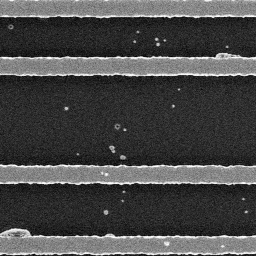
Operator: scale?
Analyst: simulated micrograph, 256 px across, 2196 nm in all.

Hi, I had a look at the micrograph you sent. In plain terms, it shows lines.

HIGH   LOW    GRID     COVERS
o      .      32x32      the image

oooooooooooooooooooooooooooooooo
oooooooooooooooooooooooooooooooo
................................
................................
................................
................................
................................
oooooooooooooooooooooooooooooooo
oooooooooooooooooooooooooooooooo
...........................o....
................................
................................
................................
................................
................................
................................
................................
................................
................................
................................
................................
oooooooooooooooooooooooooooooooo
oooooooooooooooooooooooooooooooo
................................
................................
................................
................................
................................
................................
oooo............................
oooooooooooooooooooooooooooooooo
oooooooooooooooooooooooooooooooo